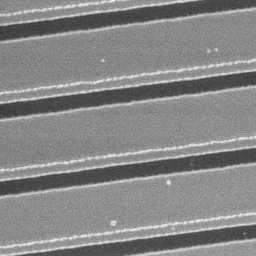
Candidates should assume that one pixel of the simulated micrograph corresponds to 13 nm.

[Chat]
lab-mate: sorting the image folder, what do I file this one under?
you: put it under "lines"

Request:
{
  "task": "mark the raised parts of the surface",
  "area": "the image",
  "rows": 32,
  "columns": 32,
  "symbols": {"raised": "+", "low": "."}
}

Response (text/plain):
+++++++++++++++++++++...........
+++++++++++++................+++
+++++................+++++++++++
.............+++++++++++++++++++
.......+++++++++++++++++++++++++
++++++++++++++++++++++++++++++++
++++++++++++++++++++++++++++++++
++++++++++++++++++++++++++++++++
++++++++++++++++++++++++++++++++
+++++++++++++++++++++++++++.....
++++++++++++++++++..............
+++++++++++................+++++
+++.................++++++++++++
............++++++++++++++++++++
....++++++++++++++++++++++++++++
++++++++++++++++++++++++++++++++
++++++++++++++++++++++++++++++++
++++++++++++++++++++++++++++++++
+++++++++++++++++++++++++++++++.
++++++++++++++++++++++++........
+++++++++++++++.................
++++++++................++++++++
+...............++++++++++++++++
........++++++++++++++++++++++++
..++++++++++++++++++++++++++++++
++++++++++++++++++++++++++++++++
++++++++++++++++++++++++++++++++
++++++++++++++++++++++++++++++++
+++++++++++++++++++++++++++.....
++++++++++++++++++++............
++++++++++++................++++
++++................++++++++++++